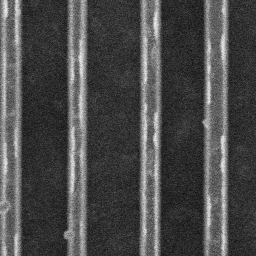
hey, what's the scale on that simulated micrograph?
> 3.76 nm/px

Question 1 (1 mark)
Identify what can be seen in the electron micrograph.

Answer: one or a few lines or trenches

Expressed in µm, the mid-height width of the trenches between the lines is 0.185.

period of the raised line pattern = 257 nm